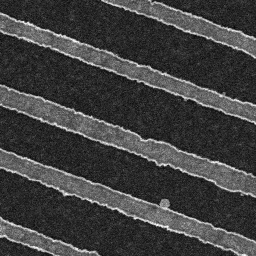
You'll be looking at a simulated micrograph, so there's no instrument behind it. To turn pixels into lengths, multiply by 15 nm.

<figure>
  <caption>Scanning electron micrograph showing one or a few lines or trenches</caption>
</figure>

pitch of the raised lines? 64.1 px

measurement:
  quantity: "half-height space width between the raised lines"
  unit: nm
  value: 732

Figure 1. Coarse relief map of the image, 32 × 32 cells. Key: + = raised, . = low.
..............++++++............
.................++++++.........
++..................++++++......
+++++.................++++++....
..++++++.................++++++.
.....+++++..................++++
........+++++..................+
..........++++++................
.............++++++.............
................+++++...........
..................++++++........
++...................++++++.....
++++++..................+++++...
.+++++++...................+++++
....+++++++...................++
.......+++++++..................
.........+++++++................
............++++++..............
...............+++++++..........
++................++++++........
+++++...............++++++++....
..++++++...............+++++++..
....+++++++...............++++++
.......++++++...............++++
..........++++++................
.............++++++.............
...............+++++++..........
..................++++++........
+++..................++++++.....
+++++...................++++++..
...+++++...................+++++
......+++++..................+++